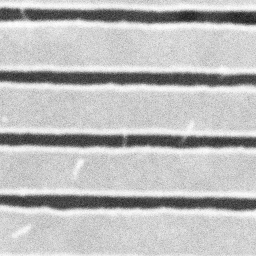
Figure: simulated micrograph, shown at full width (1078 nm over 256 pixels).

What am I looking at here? lines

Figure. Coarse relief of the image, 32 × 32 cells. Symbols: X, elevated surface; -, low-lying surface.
XXXXXXXXXXXXXXXXXXXXXXXXXXXXXXXX
--------------------------------
--------------------------------
XXXXXXXXXXXXXXXXXXXXXXXXXXXXXXXX
XXXXXXXXXXXXXXXXXXXXXXXXXXXXXXXX
XXXXXXXXXXXXXXXXXXXXXXXXXXXXXXXX
XXXXXXXXXXXXXXXXXXXXXXXXXXXXXXXX
XXXXXXXXXXXXXXXXXXXXXXXXXXXXXXXX
XXXXXXXXXXXXXXXXXXXXXXXXXXXXXXXX
--------------------------------
--------------------------------
XXXXXXXXXXXXXXXXXXXXXXXXXXXXXXXX
XXXXXXXXXXXXXXXXXXXXXXXXXXXXXXXX
XXXXXXXXXXXXXXXXXXXXXXXXXXXXXXXX
XXXXXXXXXXXXXXXXXXXXXXXXXXXXXXXX
XXXXXXXXXXXXXXXXXXXXXXXXXXXXXXXX
-------XXXXXXXXXXXXXXXXXXXXXXXXX
--------------------------------
XXXXX-------------X-------------
XXXXXXXXXXXXXXXXXXXXXXXXXXXXXXXX
XXXXXXXXXXXXXXXXXXXXXXXXXXXXXXXX
XXXXXXXXXXXXXXXXXXXXXXXXXXXXXXXX
XXXXXXXXXXXXXXXXXXXXXXXXXXXXXXXX
XXXXXXXXXXXXXXXXXXXXXXXXXXXXXXXX
--------------------------------
--------------------------------
XXXXXXXXXXXXXXXXXXXXXXXXXXX----X
XXXXXXXXXXXXXXXXXXXXXXXXXXXXXXXX
XXXXXXXXXXXXXXXXXXXXXXXXXXXXXXXX
XXXXXXXXXXXXXXXXXXXXXXXXXXXXXXXX
XXXXXXXXXXXXXXXXXXXXXXXXXXXXXXXX
XXXXXXXXXXXXXXXXXXXXXXXXXXXXXXXX